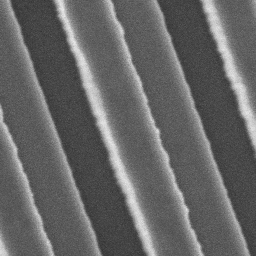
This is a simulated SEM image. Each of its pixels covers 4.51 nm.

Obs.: lines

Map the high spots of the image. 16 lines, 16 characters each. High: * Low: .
*...******...***
*...******...***
*...*******...**
**...******...**
**...******...**
**....******...*
***...******...*
***...******....
****...******...
****...******...
****...*******..
*****...******..
*****...******..
*****....******.
******...******.
******...******.